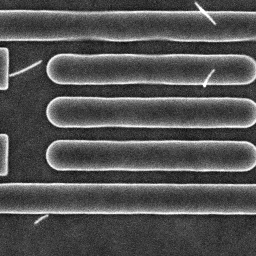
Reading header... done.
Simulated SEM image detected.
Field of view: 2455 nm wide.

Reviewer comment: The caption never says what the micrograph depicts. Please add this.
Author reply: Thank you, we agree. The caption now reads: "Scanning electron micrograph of groups of lines, slits or small figures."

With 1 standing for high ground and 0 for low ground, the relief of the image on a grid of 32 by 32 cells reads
00000000000000000000000000000000
11111111000000000111000011000000
11111111111111111111111111111111
11111111111111111111111111111111
11111111111111111111111111111111
00000000000000000000000000000000
10000000000000000000000000000000
10000011111111111111111111111111
10000011111111111111111111111111
10000011111111111111111111111111
10000000000000000000000001010000
00000000000000000000000000000000
00000001111111111111111111111110
00000011111111111111111111111111
00000011111111111111111111111111
00000001111111111111111111111111
00000000000000000000000000000000
10000000000000000000000000000000
10000011111111111111111111111111
10000011111111111111111111111111
10000011111111111111111111111111
10000000000000000000000000000000
00000000000000000000000000000000
11111111111111111111111111111111
11111111111111111111111111111111
11111111111111111111111111111111
11111111111111111111111111111111
00000000000000000000000000000000
00000000000000000000000000000000
00000000000000000000000000000000
00000000000000000000000000000000
00000000000000000000000000000000